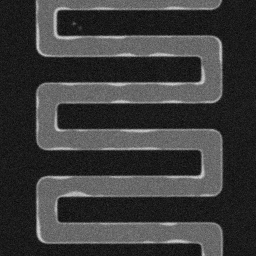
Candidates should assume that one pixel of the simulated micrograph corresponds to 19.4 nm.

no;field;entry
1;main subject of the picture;groups of lines, slits or small figures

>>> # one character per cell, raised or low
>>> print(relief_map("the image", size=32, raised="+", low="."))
.....++++++++++++++++++++++.....
.....++.........................
.....++.........................
.....++.........................
.....++.........................
.....+++++++++++++++++++++++....
.....+++++++++++++++++++++++....
.........................+++....
.........................+++....
.........................+++....
.....+++++++++++++++++++++++....
.....+++++++++++++++++++++++....
.....++++++++++++++++++++++.....
.....++.........................
.....++.........................
.....++.........................
.....++++++++++++++++++++++.....
.....+++++++++++++++++++++++....
.....+++++++++++++++++++++++....
.........................+++....
.........................+++....
.........................+++....
.....+++++++++++++++++++++++....
.....+++++++++++++++++++++++....
.....+++........................
.....++.........................
.....++.........................
.....++.........................
.....+++++++++++++++++++++++....
.....+++++++++++++++++++++++....
.........................+++....
.........................+++....